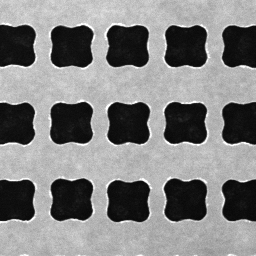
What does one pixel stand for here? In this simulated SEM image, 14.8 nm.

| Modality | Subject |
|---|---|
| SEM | a regular array of holes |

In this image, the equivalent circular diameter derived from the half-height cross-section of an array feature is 0.669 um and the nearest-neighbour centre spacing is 0.839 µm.